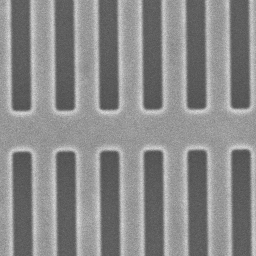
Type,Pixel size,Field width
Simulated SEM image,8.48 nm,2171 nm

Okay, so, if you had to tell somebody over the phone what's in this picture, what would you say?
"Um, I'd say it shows groups of lines, slits or small figures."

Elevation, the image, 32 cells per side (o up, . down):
o...ooo..ooo...ooo..ooo...ooo..o
o...ooo..ooo...ooo..ooo...ooo..o
o...ooo..ooo...ooo..ooo...ooo..o
o...ooo..ooo...ooo..ooo...ooo..o
o...ooo..ooo...ooo..ooo...ooo..o
o...ooo..ooo...ooo..ooo...ooo..o
o...ooo..ooo...ooo..ooo...ooo..o
o...ooo..ooo...ooo..ooo...ooo..o
o...ooo..ooo...ooo..ooo...ooo..o
o...ooo..ooo...ooo..ooo...ooo..o
o...ooo..ooo...ooo..ooo...ooo..o
o...ooo..ooo...ooo..ooo...ooo..o
o...ooo..ooo...ooo..ooo...ooo..o
o...ooo..oooo..ooo..oooo..ooo..o
oooooooooooooooooooooooooooooooo
oooooooooooooooooooooooooooooooo
oooooooooooooooooooooooooooooooo
oooooooooooooooooooooooooooooooo
oooooooooooooooooooooooooooooooo
oo..ooo..ooo...ooo..ooo...ooo..o
o...ooo...oo...ooo...oo...ooo..o
o...ooo...oo...ooo...oo...ooo..o
o...ooo...oo...ooo...oo...ooo..o
o...ooo...oo...ooo...oo...ooo..o
o...ooo...oo...ooo...oo...ooo..o
o...ooo...oo...ooo...oo...ooo...
o...ooo...oo...ooo...oo...ooo...
o...ooo...oo...ooo...oo...ooo...
oo..ooo...oo...ooo...oo...ooo...
oo..ooo...oo...ooo...oo...ooo...
oo..ooo...oo...ooo...oo...ooo...
oo..ooo...oo...ooo...oo...ooo...